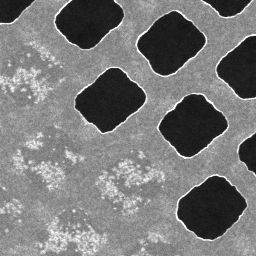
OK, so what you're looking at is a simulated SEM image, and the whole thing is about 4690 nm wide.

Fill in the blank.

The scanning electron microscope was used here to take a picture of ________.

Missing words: holes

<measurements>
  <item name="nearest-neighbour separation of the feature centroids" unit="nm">1540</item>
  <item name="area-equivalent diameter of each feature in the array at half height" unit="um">1.11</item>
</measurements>